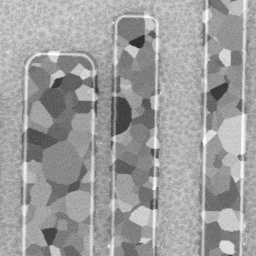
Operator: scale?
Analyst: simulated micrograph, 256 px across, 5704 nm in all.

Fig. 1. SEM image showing one or a few lines or trenches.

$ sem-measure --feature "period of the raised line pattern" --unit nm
1850